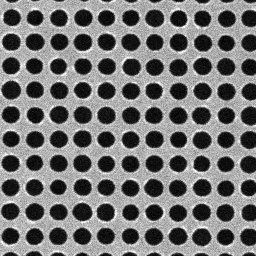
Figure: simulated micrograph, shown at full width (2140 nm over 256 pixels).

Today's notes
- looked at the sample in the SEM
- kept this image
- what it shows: a regular array of holes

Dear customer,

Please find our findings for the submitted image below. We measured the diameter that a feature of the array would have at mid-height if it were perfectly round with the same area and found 152 nanometers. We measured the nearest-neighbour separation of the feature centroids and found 196 nm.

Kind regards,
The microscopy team